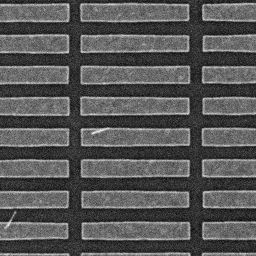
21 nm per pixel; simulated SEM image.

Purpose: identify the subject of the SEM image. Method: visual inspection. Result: wiring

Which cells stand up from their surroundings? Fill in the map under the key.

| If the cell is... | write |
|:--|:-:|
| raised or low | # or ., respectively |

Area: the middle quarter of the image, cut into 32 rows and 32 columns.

................................
#...###########################.
#...###########################.
#...###########################.
#...###########################.
................................
................................
................................
#...###################.........
#...###########################.
#...###########################.
#...###########################.
#...##################..........
................................
................................
................................
#...###########################.
#...###########################.
#...###########################.
#...###########################.
................................
................................
................................
................................
#...###########################.
#...###########################.
#...###########################.
#...###########################.
................................
................................
................................
................................